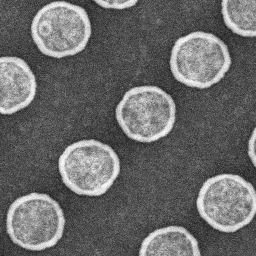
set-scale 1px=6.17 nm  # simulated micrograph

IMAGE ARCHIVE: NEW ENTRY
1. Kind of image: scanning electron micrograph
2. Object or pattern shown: raised bodies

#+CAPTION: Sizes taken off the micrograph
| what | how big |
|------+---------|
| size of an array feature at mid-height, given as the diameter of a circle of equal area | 330 nanometres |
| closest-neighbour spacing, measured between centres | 473 nanometers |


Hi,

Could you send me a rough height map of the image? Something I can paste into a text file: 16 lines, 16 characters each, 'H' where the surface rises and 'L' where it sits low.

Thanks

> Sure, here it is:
LLLHHLLLLLLLLLHH
LLHHHLLLLLLLLLHH
LLHHHLLLLLLHHHLL
LLLLLLLLLLLHHHLL
HHLLLLLLLLLHHHLL
HHLLLLLLLLLLLLLL
HHLLLLLLHHHLLLLL
LLLLLLLLHHHLLLLL
LLLLLLLLHHLLLLLL
LLLLHHHLLLLLLLLL
LLLLHHHLLLLLLLLL
LLLLHHHLLLLLLHHL
LHHLLLLLLLLLLHHH
LHHHLLLLLLLLLHHH
LHHHLLLLLLHHLLLL
LLLLLLLLLHHHLLLL